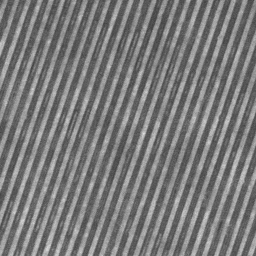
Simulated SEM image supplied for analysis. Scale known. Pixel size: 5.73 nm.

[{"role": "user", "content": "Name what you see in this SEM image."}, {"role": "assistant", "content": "parallel lines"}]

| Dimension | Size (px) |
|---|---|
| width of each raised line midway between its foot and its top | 4.5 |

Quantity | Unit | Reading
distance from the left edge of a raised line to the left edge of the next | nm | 62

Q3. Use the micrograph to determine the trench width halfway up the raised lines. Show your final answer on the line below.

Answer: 6.39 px